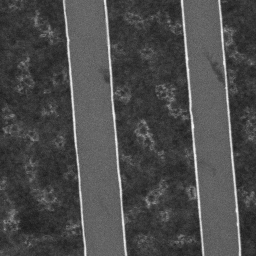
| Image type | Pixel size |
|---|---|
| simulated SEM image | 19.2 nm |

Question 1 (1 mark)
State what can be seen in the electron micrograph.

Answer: one or a few lines or trenches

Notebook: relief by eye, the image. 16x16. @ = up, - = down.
@@@@---@@@@---@@
@@@@---@@@@@--@@
@@@@---@@@@@--@@
@@@@---@@@@@--@@
@@@@---@@@@@--@@
@@@@@--@@@@@--@@
@@@@@--@@@@@--@@
@@@@@--@@@@@--@@
@@@@@--@@@@@--@@
@@@@@--@@@@@--@@
@@@@@--@@@@@---@
@@@@@---@@@@---@
@@@@@---@@@@---@
@@@@@---@@@@@--@
@@@@@---@@@@@--@
@@@@@---@@@@@--@